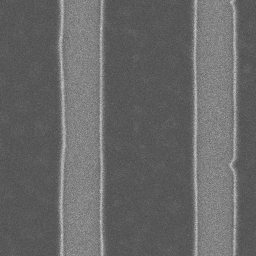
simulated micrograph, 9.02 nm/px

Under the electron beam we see one or a few lines or trenches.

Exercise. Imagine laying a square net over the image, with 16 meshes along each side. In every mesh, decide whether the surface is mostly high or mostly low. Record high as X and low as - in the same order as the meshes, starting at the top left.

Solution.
XXXX--XXXXXX---X
XXXX--XXXXXX---X
XXXX--XXXXXX---X
XXXX--XXXXXX---X
XXXX--XXXXXX---X
XXXX--XXXXXX---X
XXXX--XXXXXX---X
XXXX--XXXXXX---X
XXXX--XXXXXX---X
XXXX--XXXXXX---X
XXXX--XXXXXX---X
XXXX--XXXXXX---X
XXXX--XXXXXX---X
XXXX--XXXXXX---X
XXXX--XXXXXX---X
XXXX--XXXXXX---X